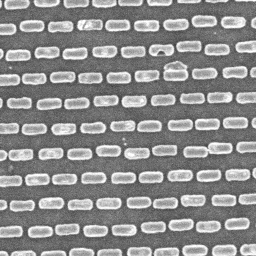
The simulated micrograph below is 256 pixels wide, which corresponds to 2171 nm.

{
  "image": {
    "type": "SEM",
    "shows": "a regular array of raised bodies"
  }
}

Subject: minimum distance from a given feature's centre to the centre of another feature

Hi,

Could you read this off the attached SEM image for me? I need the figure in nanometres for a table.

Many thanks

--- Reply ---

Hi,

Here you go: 233